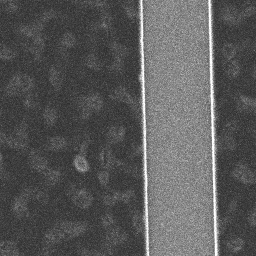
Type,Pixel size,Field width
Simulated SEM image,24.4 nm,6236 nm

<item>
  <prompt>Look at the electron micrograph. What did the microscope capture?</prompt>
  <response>one or a few lines or trenches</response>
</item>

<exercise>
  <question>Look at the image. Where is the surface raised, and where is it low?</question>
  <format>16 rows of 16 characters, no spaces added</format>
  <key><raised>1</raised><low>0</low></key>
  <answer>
1111111110000111
1111111110000111
1111111110000111
1111111110000111
1111111110000111
1111111110000111
1111111110000111
1111111110000111
1111111110000111
1111111110000111
1111111110000111
1111111110000111
1111111110000111
1111111110000111
1111111110000111
1111111110000111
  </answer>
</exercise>